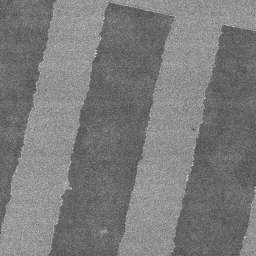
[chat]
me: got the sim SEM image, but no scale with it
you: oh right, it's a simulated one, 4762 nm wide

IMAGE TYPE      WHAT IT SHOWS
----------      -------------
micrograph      one or a few lines or trenches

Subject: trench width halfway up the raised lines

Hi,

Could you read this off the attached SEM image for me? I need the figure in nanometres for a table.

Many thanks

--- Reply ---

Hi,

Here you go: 922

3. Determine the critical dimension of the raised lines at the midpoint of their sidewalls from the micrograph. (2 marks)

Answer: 1240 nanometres